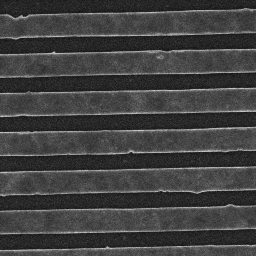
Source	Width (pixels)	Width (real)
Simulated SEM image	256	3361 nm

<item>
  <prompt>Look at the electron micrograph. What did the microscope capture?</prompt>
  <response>parallel lines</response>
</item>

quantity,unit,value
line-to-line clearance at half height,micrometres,0.217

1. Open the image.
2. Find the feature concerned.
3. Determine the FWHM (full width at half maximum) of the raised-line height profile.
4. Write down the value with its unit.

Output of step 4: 299 nm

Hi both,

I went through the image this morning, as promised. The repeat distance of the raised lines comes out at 39.2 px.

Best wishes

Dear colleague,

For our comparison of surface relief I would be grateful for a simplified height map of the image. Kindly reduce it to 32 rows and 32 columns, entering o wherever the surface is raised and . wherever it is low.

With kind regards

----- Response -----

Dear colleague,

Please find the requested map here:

................................
.....................ooooooooooo
oooooooooooooooooooooooooooooooo
oooooooooooooooooooooooooooooooo
ooooooo.........................
................................
...............ooooooooooooooooo
oooooooooooooooooooooooooooooooo
oooooooooooooooooooooooooooooooo
oooooooo........................
................................
...........ooooooooooooooooooooo
oooooooooooooooooooooooooooooooo
oooooooooooooooooooooooooooooooo
o...............................
................................
.......ooooooooooooooooooooooooo
oooooooooooooooooooooooooooooooo
oooooooooooooooooooooooooooooooo
................................
................................
...ooooooooooooooooooooooooooooo
oooooooooooooooooooooooooooooooo
oooooooooooooooooooooooooooooooo
................................
................................
oooooooooooooooooooooooooooooooo
oooooooooooooooooooooooooooooooo
oooooooooooooooooooooooooooooooo
................................
................................
oooooooooooooooooooooooooooooooo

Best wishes